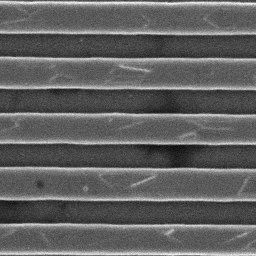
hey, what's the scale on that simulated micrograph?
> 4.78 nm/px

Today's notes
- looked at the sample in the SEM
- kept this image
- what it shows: wiring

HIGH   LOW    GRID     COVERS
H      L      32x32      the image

HHHHHHHHHHHHHHHHHHHHHHHHHHHHHHHH
HHHHHHHHHHHHHHHHHHHHHHHHHHHHHHHH
HHHHHHHHHHHHHHHHHHHHHHHHHHHHHHHH
HHHHHHHHHHHHHHHHHHHHHHHHHHHHHHHH
LLLLLLLLLLLLLLLLLLLLLLLLLLLLLLLL
LLLLLLLLLLLLLLLLLLLLLLLLLLLLLLLL
LLLLLLLLLLLLLLLLLLLLLLLLLLLLLLLL
HHHHHHHHHHHHHHHHHHHHHHHHHHHHHHHH
HHHHHHHHHHHHHHHHHHHHHHHHHHHHHHHH
HHHHHHHHHHHHHHHHHHHHHHHHHHHHHHHH
HHHHHHHHHHHHHHHHHHHHHHHHHHHHHHHH
LLLLLLLLLLLLLLLLLLLLLLLLLLLLLLLL
LLLLLLLLLLLLLLLLLLLLLLLLLLLLLLLL
LLLLLLLLLLLLLLLLLLLLLLLLLLLLLLLL
HHHHHHHHHHHHHHHHHHHHHHHHHHHHHHHH
HHHHHHHHHHHHHHHHHHHHHHHHHHHHHHHH
HHHHHHHHHHHHHHHHHHHHHHHHHHHHHHHH
HHHHHHHHHHHHHHHHHHHHHHHHHHHHHHHH
LLLLLLLLLLLLLLLLLLLLLLLLLLLLLLLL
LLLLLLLLLLLLLLLLLLLLLLLLLLLLLLLL
LLLLLLLLLLLLLLLLLLLLLLLLLLLLLLLL
HHHHHHHHHHHHHHHHHHHHHHHHHHHHHHHH
HHHHHHHHHHHHHHHHHHHHHHHHHHHHHHHH
HHHHHHHHHHHHHHHHHHHHHHHHHHHHHHHH
HHHHHHHHHHHHHHHHHHHHHHHHHHHHHHHH
LLLLLLLLLLLLLLLLLLLLLLLLLLLLLLLL
LLLLLLLLLLLLLLLLLLLLLLLLLLLLLLLL
LLLLLLLLLLLLLLLLLLLLLLLLLLLLLLLL
HHHHHHHHHHHHHHHHHHHHHHHHHHHHHHHH
HHHHHHHHHHHHHHHHHHHHHHHHHHHHHHHH
HHHHHHHHHHHHHHHHHHHHHHHHHHHHHHHH
HHHHHHHHHHHHHHHHHHHHHHHHHHHHHHHH